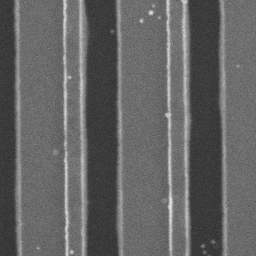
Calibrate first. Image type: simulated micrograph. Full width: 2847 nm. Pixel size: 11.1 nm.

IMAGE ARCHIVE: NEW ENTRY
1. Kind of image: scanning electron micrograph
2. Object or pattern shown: lines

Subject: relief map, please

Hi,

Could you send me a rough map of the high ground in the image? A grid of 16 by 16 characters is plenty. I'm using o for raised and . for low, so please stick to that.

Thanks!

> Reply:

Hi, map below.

.oooo..ooooo..oo
.oooo..ooooo..oo
.oooo..ooooo..oo
.oooo...oooo..oo
.oooo..ooooo..oo
.oooo...oooo..oo
.oooo...oooo..oo
.oooo...oooo..oo
.oooo...oooo..oo
.oooo...oooo..oo
.oooo...oooo..oo
.oooo...oooo..oo
.oooo...oooo..oo
.oooo...oooo..oo
.oooo...oooo..oo
.oooo...oooo..oo